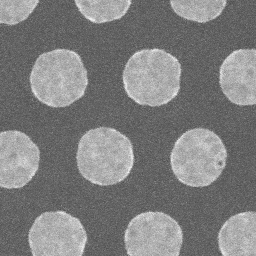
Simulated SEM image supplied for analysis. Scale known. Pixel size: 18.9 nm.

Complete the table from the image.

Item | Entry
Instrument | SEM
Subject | raised bodies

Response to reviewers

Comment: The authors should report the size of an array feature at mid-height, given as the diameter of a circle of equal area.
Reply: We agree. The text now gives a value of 1.08 microns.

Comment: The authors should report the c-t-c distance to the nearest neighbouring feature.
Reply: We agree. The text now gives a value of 1.73 microns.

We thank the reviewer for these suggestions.